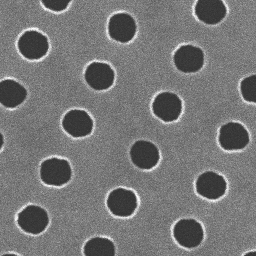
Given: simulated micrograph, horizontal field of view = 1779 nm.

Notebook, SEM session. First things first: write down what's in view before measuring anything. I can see a regular array of holes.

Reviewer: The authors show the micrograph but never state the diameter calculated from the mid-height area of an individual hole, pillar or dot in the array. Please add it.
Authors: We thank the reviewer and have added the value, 0.203 µm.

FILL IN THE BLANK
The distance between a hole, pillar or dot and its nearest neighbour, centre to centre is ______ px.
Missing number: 52.8